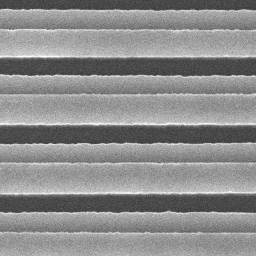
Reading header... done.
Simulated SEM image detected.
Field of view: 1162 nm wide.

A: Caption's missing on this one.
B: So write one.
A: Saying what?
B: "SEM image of lines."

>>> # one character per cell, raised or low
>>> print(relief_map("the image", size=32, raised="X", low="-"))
--------------------------------
XXXXXXXXXXXXXXXXXXXXXXXXXXXXXXXX
XXXXXXXXXXXXXXXXXXXXXXXXXXXXXXXX
XXXXXXXXXXXXXXXXXXXXXXXXXXXXXXXX
XXXXXXXXXXXXXXXXXXXXXXXXXXXXXXXX
XXXXXXXXXXXXXXXXXXXXXXXXXXXXXXXX
XXXXXXXXXXXXXXXXXXXXXXXXXXXXXXXX
--------------------------------
--------------------------------
XXXXXXXXXX-XXXX-XXXX--X---XX-XXX
XXXXXXXXXXXXXXXXXXXXXXXXXXXXXXXX
XXXXXXXXXXXXXXXXXXXXXXXXXXXXXXXX
XXXXXXXXXXXXXXXXXXXXXXXXXXXXXXXX
XXXXXXXXXXXXXXXXXXXXXXXXXXXXXXXX
XXXXXXXXXXXXXXXXXXXXXXXXXXXXXXXX
XXXXXXXXXXXXXXXXXXXXXXXXXXXXXXXX
--------------------------------
--------------------------------
XXXXXXXXXXXXXXXXXXXXXXXXXXXXXXXX
XXXXXXXXXXXXXXXXXXXXXXXXXXXXXXXX
XXXXXXXXXXXXXXXXXXXXXXXXXXXXXXXX
XXXXXXXXXXXXXXXXXXXXXXXXXXXXXXXX
XXXXXXXXXXXXXXXXXXXXXXXXXXXXXXXX
XXXXXXXXXXXXXXXXXXXXXXXXXXXXXXXX
--------------------------------
--------------------------------
-----------X---------X----------
XXXXXXXXXXXXXXXXXXXXXXXXXXXXXXXX
XXXXXXXXXXXXXXXXXXXXXXXXXXXXXXXX
XXXXXXXXXXXXXXXXXXXXXXXXXXXXXXXX
XXXXXXXXXXXXXXXXXXXXXXXXXXXXXXXX
XXXXXXXXXXXXXXXXXXXXXXXXXXXXXXXX